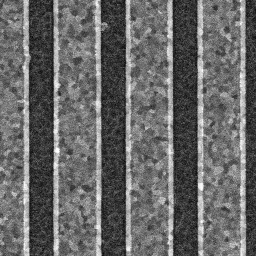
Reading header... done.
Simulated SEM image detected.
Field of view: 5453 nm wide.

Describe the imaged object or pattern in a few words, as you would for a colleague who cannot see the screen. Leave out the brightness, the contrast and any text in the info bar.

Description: one or a few lines or trenches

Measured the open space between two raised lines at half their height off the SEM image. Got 618 nanometres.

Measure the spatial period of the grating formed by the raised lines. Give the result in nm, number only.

1540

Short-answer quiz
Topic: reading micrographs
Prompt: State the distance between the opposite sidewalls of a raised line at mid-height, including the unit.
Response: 916 nm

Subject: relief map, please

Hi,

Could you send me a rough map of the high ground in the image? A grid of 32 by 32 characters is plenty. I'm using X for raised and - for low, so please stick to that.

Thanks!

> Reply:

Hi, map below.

XXX----XXXXX----XXXXX----XXXXX--
XXX----XXXXX----XXXXX----XXXXX--
XXX----XXXXX----XXXXX----XXXXX--
XXX----XXXXX----XXXXX----XXXXX--
XXX----XXXXX----XXXXX----XXXXX--
XXX----XXXXX----XXXXX----XXXXX--
XXX----XXXXX----XXXXX----XXXXX--
XXX----XXXXX----XXXXX----XXXXX--
XXX----XXXXX----XXXXX----XXXXX--
XXX----XXXXX----XXXXX----XXXXX--
XXX----XXXXX----XXXXX----XXXXX--
XXX----XXXXX----XXXXX----XXXXX--
XXX----XXXXX----XXXXX----XXXXX--
XXX----XXXXX----XXXXX----XXXXX--
XXX----XXXXX----XXXXX----XXXXX--
XXX----XXXXX----XXXXX----XXXXX--
XXX----XXXXX----XXXXX----XXXXX--
XXX----XXXXX----XXXXX----XXXXX--
XXX----XXXXX----XXXXX----XXXXX--
XXX----XXXXX----XXXXX----XXXXX--
XXX----XXXXX----XXXXX----XXXXX--
XXX----XXXXX----XXXXX----XXXXX--
XXX----XXXXX----XXXXX----XXXXX--
XXX----XXXXX----XXXXX----XXXXX--
XXX----XXXXX----XXXXX----XXXXX--
XXX----XXXXX----XXXXX----XXXXX--
XXX----XXXXX----XXXXX----XXXXX--
XXX----XXXXX----XXXXX----XXXXX--
XXX----XXXXX----XXXXX----XXXXX--
XXX----XXXXX----XXXXX----XXXXX--
XXX----XXXXX----XXXXX----XXXXX--
XXX----XXXXX----XXXXX----XXXXX--